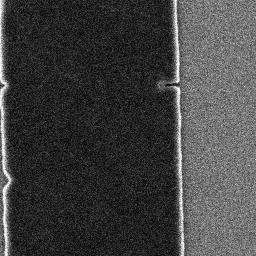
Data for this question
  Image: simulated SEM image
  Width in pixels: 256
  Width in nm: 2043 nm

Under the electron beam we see one or a few lines or trenches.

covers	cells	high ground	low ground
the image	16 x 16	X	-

XXXXXXXXXXX-----
XXXXXXXXXXX-----
XXXXXXXXXXX-----
XXXXXXXXXXX-----
XXXXXXXXXXX-----
XXXXXXXXXXX-----
XXXXXXXXXXX-----
XXXXXXXXXXX-----
XXXXXXXXXXX-----
XXXXXXXXXXX-----
XXXXXXXXXXX-----
XXXXXXXXXXX-----
XXXXXXXXXXX-----
XXXXXXXXXXX-----
XXXXXXXXXXX-----
XXXXXXXXXXX-----